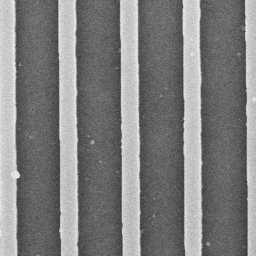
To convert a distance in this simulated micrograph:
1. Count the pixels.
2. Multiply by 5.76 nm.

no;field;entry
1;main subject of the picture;lines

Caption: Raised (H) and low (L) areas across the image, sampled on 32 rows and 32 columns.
HHLLLLLHHLLLLLLHHLLLLLLHHLLLLLLH
HHLLLLLHHLLLLLLHHLLLLLLHHLLLLLLH
HHLLLLLHHLLLLLLHHLLLLLLHHLLLLLLH
HHLLLLLHHLLLLLLHHLLLLLLHHLLLLLLH
HHLLLLLHHLLLLLLHHLLLLLLHHLLLLLLH
HHLLLLLHHLLLLLLHHLLLLLLHHLLLLLLH
HHLLLLLHHLLLLLLHHLLLLLLHHLLLLLLH
HHLLLLLHHLLLLLLHHLLLLLLHHLLLLLLH
HHLLLLLHHLLLLLLHHLLLLLLHHLLLLLLH
HHLLLLLHHLLLLLLHHLLLLLLHHLLLLLLH
HHLLLLLHHLLLLLLHHLLLLLLHHLLLLLLH
HHLLLLLHHLLLLLLHHLLLLLLHHLLLLLLH
HHLLLLLHHLLLLLLHHLLLLLLHHLLLLLLH
HHLLLLLHHLLLLLLHHLLLLLLHHLLLLLLH
HHLLLLLHHLLLLLLHHLLLLLLHHLLLLLLH
HHLLLLLHHLLLLLLHHLLLLLLHHLLLLLLH
HHLLLLLHHHLLLLLHHLLLLLLHHLLLLLLH
HHLLLLLHHHLLLLLHHLLLLLLHHLLLLLLH
HHLLLLLLHHLLLLLHHLLLLLLHHLLLLLLH
HHLLLLLLHHLLLLLHHLLLLLLHHLLLLLLH
HHLLLLLLHHLLLLLHHLLLLLLHHLLLLLLH
HHLLLLLLHHLLLLLHHLLLLLLHHLLLLLLH
HHLLLLLLHHLLLLLHHLLLLLLHHLLLLLLH
HHLLLLLLHHLLLLLHHLLLLLLHHLLLLLLH
HHLLLLLLHHLLLLLHHLLLLLLHHLLLLLLH
HHLLLLLLHHLLLLLHHLLLLLLHHLLLLLLH
HHLLLLLLHHLLLLLHHLLLLLLHHLLLLLLH
HHLLLLLLHHLLLLLHHLLLLLLHHLLLLLLH
HHLLLLLHHHLLLLLHHLLLLLLHHLLLLLLH
HHLLLLLLHHLLLLLHHLLLLLLHHLLLLLLH
HHLLLLLLHHLLLLLHHLLLLLLHHLLLLLLH
HHLLLLLLHHLLLLLHHLLLLLLHHLLLLLLH